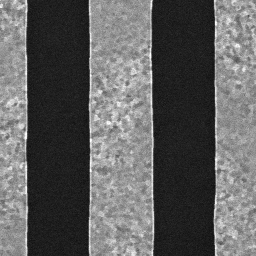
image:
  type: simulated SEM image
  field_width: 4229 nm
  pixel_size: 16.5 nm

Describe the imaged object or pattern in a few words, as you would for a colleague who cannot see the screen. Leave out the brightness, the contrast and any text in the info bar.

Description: wiring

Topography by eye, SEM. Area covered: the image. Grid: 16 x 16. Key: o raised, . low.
oo....oooo...ooo
oo....ooo.....oo
oo....ooo....ooo
oo....ooo....ooo
oo....ooo....ooo
oo....ooo....ooo
oo....oooo....oo
oo....oooo....oo
oo....oooo....oo
oo....oooo....oo
oo....oooo....oo
oo....oooo....oo
oo....oooo...ooo
oo....oooo...ooo
oo....oooo...ooo
oo....oooo...ooo